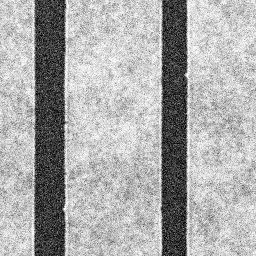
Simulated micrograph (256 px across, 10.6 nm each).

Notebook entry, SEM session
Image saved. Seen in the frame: one or a few lines or trenches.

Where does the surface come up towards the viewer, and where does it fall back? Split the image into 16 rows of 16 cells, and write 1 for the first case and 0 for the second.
1100111111001111
1100111111001111
1100111111001111
1100111111001111
1100111111001111
1100111111001111
1100111111001111
1100111111001111
1100111111001111
1100111111001111
1100111111001111
1100111111001111
1100111111001111
1100111111001111
1100111111001111
1100111111001111